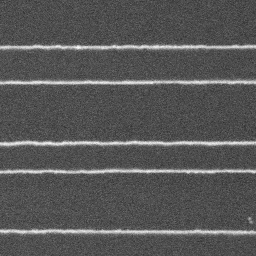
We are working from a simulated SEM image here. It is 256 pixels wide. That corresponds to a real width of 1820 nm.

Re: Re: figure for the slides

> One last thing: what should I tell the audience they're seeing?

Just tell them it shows lines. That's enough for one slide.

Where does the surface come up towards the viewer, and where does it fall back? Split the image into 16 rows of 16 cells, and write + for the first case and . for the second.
................
................
................
++++++++++++++++
++++++++++++++++
................
................
................
................
++++++++++++++++
++++++++++++++++
................
................
................
++++++++++++++++
++++++++++++++++